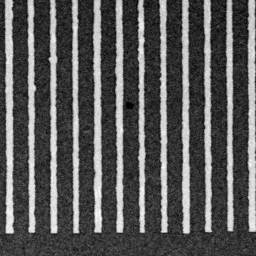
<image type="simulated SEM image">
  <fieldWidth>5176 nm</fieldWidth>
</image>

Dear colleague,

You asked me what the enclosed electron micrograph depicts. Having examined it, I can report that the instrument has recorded parallel lines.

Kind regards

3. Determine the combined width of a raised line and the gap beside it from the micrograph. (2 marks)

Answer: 0.446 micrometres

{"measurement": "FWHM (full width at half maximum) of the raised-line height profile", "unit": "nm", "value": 114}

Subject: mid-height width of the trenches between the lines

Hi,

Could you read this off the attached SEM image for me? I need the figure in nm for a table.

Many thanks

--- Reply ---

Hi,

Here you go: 331